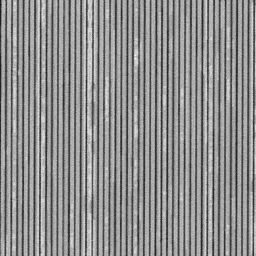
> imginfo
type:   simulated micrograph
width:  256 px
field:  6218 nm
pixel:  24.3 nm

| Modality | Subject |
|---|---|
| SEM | parallel lines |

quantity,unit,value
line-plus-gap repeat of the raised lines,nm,140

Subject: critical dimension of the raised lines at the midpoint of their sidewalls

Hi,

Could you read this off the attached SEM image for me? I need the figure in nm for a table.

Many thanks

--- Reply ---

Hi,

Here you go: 88.1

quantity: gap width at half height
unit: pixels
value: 1.75